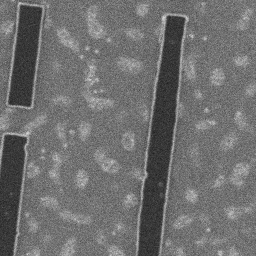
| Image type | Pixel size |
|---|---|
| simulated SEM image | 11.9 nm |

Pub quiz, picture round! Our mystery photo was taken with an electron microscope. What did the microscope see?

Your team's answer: one or a few lines or trenches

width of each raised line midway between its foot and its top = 294 nm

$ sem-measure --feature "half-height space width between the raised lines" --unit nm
1430